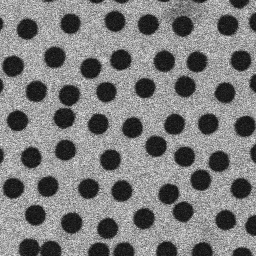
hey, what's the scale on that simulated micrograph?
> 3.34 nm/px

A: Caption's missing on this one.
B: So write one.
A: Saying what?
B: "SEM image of a regular array of holes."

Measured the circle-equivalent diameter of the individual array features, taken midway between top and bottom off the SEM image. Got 0.0698 µm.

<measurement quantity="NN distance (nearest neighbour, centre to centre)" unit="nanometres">110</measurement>